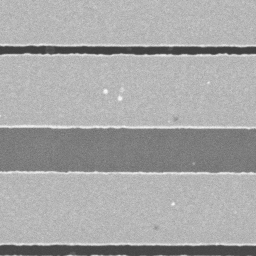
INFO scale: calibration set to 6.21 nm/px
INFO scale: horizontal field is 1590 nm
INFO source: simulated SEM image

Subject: lines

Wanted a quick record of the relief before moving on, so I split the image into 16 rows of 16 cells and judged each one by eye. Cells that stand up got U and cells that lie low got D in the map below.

UUUUUUUUUUUUUUUU
UUUUUUUUUUUUUUUU
UUUUUUUUUUUUUUUU
UUUUUUUUUUUUUUUU
UUUUUUUUUUUUUUUU
UUUUUUUUUUUUUUUU
UUUUUUUUUUUUUUUU
UUUUUUUUUUUUUUUU
DDDDDDDDDDDDDDDD
DDDDDDDDDDDDDDDD
DDDDDDDDDDDDDDDD
UUUUUUUUUUUUUUUU
UUUUUUUUUUUUUUUU
UUUUUUUUUUUUUUUU
UUUUUUUUUUUUUUUU
DDDDDDDDDDDDDDDD